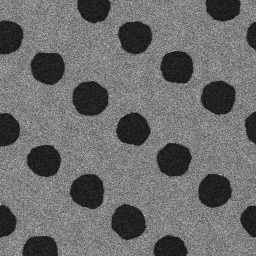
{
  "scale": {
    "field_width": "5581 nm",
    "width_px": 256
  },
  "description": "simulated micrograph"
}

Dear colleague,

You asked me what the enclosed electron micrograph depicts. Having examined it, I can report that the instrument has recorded a regular array of holes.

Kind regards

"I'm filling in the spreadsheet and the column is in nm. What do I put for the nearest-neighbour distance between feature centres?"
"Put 1120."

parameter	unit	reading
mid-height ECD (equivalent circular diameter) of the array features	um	0.732